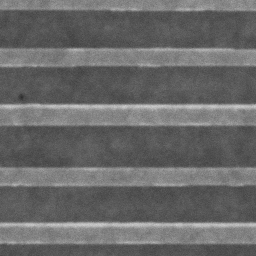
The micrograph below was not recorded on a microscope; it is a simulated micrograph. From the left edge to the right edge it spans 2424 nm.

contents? lines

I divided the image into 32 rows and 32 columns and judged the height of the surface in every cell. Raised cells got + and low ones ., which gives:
++++++++++++++++++++++++++++++++
................................
................................
................................
................................
................................
++++++++++++++++++++++++++++++++
++++++++++++++++++++++++++++++++
................................
................................
................................
................................
................................
++++++++++++++++++++++++++++++++
++++++++++++++++++++++++++++++++
++++++++++++++++++++++++++++++++
................................
................................
................................
................................
................................
++++++++++++++++++++++++++++++++
++++++++++++++++++++++++++++++++
................................
................................
................................
................................
................................
++++++++++++++++++++++++++++++++
++++++++++++++++++++++++++++++++
................................
................................